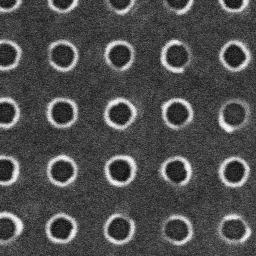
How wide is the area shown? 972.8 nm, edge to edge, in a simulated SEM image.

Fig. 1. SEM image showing a regular array of holes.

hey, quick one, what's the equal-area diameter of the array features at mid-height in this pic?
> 0.0887 um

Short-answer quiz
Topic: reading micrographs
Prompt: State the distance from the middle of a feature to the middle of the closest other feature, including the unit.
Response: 0.217 um